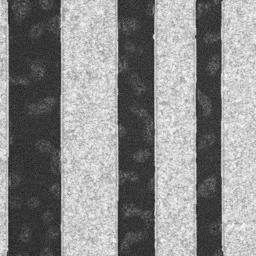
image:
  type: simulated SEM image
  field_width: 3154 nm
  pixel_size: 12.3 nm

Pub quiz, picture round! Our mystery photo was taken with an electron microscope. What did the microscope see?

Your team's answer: one or a few lines or trenches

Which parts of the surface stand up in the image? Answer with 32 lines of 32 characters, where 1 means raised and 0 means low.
10000000111111100001111100001111
10000000111111100001111100001111
10000000111111100001111100001111
10000000111111100001111100001111
10000000111111100001111100001111
10000000111111100001111100001111
10000000111111100001111100001111
10000000111111100001111100001111
10000000111111100001111100001111
10000000111111100001111100001111
10000000111111100001111100001111
10000000111111100001111100001111
10000000111111100001111100001111
10000000111111100001111100001111
10000000111111100001111100001111
10000000111111100001111100001111
10000000111111100001111100001111
10000000111111100001111100001111
10000000111111100001111100001111
10000000111111100001111100001111
10000000111111100001111100001111
10000000111111100001111100001111
10000000111111100001111100001111
10000000111111100001111100001111
10000000111111100001111100001111
10000000111111100001111100001111
10000000111111100001111100001111
10000000111111100001111100001111
10000000111111100001111100001111
10000000111111100001111100001111
10000000111111100001111100001111
10000000111111100001111100001111